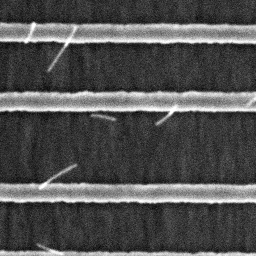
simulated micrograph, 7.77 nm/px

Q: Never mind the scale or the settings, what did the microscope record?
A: lines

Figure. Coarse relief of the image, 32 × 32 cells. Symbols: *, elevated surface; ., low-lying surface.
................................
................................
................................
********************************
********************************
................................
................................
................................
................................
................................
................................
................................
********************************
********************************
................................
................................
................................
................................
................................
................................
................................
................................
................................
********************************
********************************
................................
................................
................................
................................
................................
................................
*..**.**........................